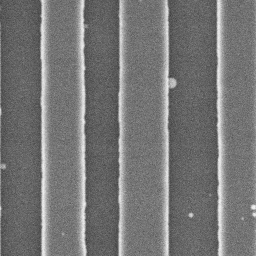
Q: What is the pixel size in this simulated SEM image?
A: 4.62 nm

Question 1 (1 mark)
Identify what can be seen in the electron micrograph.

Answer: lines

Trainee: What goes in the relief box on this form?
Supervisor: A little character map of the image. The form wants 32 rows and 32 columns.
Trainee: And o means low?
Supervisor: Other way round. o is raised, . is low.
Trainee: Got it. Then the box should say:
.....ooooo.....oooooo......ooooo
.....ooooo.....oooooo......ooooo
.....ooooo.....oooooo......ooooo
.....ooooo.....oooooo......ooooo
.....ooooo.....oooooo......ooooo
.....ooooo.....oooooo......ooooo
.....ooooo.....oooooo......ooooo
.....ooooo.....oooooo......ooooo
.....ooooo.....oooooo......ooooo
.....ooooo.....oooooo......ooooo
.....ooooo.....oooooo......ooooo
.....oooooo....oooooo......ooooo
.....oooooo....oooooo......ooooo
.....oooooo....oooooo......ooooo
.....ooooo.....oooooo......ooooo
.....ooooo.....oooooo......ooooo
.....ooooo.....oooooo......ooooo
.....ooooo.....oooooo......ooooo
.....ooooo.....oooooo......ooooo
.....ooooo.....oooooo......ooooo
.....oooooo....oooooo......ooooo
.....oooooo....oooooo......ooooo
.....oooooo....oooooo......ooooo
.....oooooo....oooooo......ooooo
.....oooooo....oooooo......ooooo
.....oooooo....oooooo......ooooo
.....ooooo.....oooooo......ooooo
.....oooooo....oooooo......ooooo
.....oooooo....oooooo......ooooo
.....ooooo.....oooooo......ooooo
.....oooooo....oooooo......ooooo
.....oooooo....oooooo......ooooo